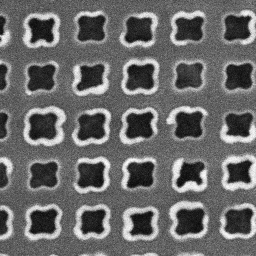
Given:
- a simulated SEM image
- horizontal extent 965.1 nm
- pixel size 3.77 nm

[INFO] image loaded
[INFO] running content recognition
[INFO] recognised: a regular array of holes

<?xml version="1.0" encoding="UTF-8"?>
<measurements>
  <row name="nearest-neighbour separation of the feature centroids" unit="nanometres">180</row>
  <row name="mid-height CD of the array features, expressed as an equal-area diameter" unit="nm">107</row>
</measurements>